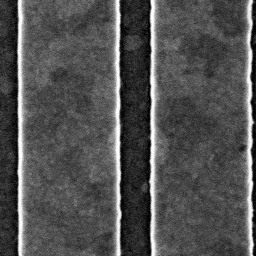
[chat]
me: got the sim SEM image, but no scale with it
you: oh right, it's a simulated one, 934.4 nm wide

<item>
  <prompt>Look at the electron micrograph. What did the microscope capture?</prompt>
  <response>one or a few lines or trenches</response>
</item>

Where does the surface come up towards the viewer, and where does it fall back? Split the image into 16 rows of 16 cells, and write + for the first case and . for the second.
.++++++..+++++++
.++++++..+++++++
.++++++..+++++++
.++++++...++++++
.++++++...++++++
.++++++...++++++
.++++++...++++++
.++++++...++++++
.++++++...++++++
.++++++...++++++
.++++++...++++++
.++++++..+++++++
.++++++...++++++
.++++++...++++++
.++++++..+++++++
.++++++...++++++